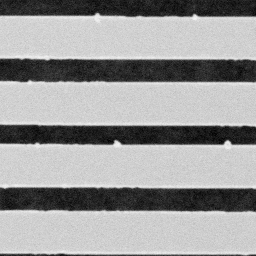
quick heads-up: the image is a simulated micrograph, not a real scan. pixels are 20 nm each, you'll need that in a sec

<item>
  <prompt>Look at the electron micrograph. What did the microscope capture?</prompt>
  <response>lines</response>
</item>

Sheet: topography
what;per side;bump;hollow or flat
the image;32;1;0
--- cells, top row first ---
00000000000000000000000000000000
00000000000000000000000000000000
11111111111111111111111111111111
11111111111111111111111111111111
11111111111111111111111111111111
11111111111111111111111111111111
11111111111111111111111111111111
00000000000000000000000000000000
00000000000000000000000000000000
00000000000000000000000000000000
11111111111111111111111111111111
11111111111111111111111111111111
11111111111111111111111111111111
11111111111111111111111111111111
11111111111111111111111111111111
00000101111111111111111111111111
00000000000000000000000000000000
00000000000000000000000000000000
11111111111111111111111111111111
11111111111111111111111111111111
11111111111111111111111111111111
11111111111111111111111111111111
11111111111111111111111111111111
00000000000000000000000000000000
00000000000000000000000000000000
00000000000000000000000000000000
11111111111111111111111111110011
11111111111111111111111111111111
11111111111111111111111111111111
11111111111111111111111111111111
11111111111111111111111111111111
11111111111111111111111111111111